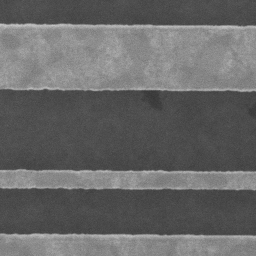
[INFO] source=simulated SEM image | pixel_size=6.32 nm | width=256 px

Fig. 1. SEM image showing lines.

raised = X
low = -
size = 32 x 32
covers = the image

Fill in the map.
--------------------------------
--------------------------------
--------------------------------
XXXXXXXXXXXXXXXXXXXXXXXXXXXXXXXX
XXXXXXXXXXXXXXXXXXXXXXXXXXXXXXXX
XXXXXXXXXXXXXXXXXXXXXXXXXXXXXXXX
XXXXXXXXXXXXXXXXXXXXXXXXXXXXXXXX
XXXXXXXXXXXXXXXXXXXXXXXXXXXXXXXX
XXXXXXXXXXXXXXXXXXXXXXXXXXXXXXXX
XXXXXXXXXXXXXXXXXXXXXXXXXXXXXXXX
XXXXXXXXXXXXXXXXXXXXXXXXXXXXXXXX
--------------------------------
--------------------------------
--------------------------------
--------------------------------
--------------------------------
--------------------------------
--------------------------------
--------------------------------
--------------------------------
--------------------------------
XXXXXXXXXXXXXXXXXXXXXXXXXXXXXXXX
XXXXXXXXXXXXXXXXXXXXXXXXXXXXXXXX
--------X-X-X--XXXXXXXXXXXXXXXXX
--------------------------------
--------------------------------
--------------------------------
--------------------------------
--------------------------------
XXXXXXXXXXXXXXXXXXXXXXXXXXXXXXXX
XXXXXXXXXXXXXXXXXXXXXXXXXXXXXXXX
XXXXXXXXXXXXXXXXXXXXXXXXXXXXXXXX